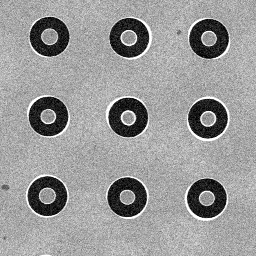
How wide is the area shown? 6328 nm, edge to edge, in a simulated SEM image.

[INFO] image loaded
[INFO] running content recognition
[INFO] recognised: an array of small figures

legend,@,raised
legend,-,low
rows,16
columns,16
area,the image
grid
@@@@@@@@@@@@@@@@
@@--@@@--@@@--@@
@@--@@@--@@@--@@
@@@@@@@@-@@@--@@
@@@@@@@@@@@@@@@@
@@@@@@@@@@@@@@@@
@@--@@@--@@@--@@
@@--@@@--@@@--@@
@@@@@@@@@@@@--@@
@@@@@@@@@@@@@@@@
@@@@@@@@@@@@@@@@
@@--@@@--@@@--@@
@@--@@@--@@@--@@
@@@@@@@@@@@@--@@
@@@@@@@@@@@@@@@@
@@@@@@@@@@@@@@@@